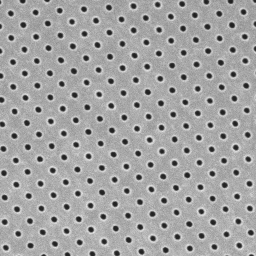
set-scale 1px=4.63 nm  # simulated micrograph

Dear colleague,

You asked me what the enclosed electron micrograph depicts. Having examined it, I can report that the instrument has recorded a regular array of holes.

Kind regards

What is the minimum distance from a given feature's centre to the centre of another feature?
77.8 nanometers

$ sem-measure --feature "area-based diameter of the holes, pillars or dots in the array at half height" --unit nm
28.6